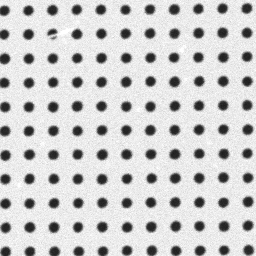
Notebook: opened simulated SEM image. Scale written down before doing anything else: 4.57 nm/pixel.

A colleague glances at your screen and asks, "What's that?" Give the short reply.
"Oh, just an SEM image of a regular array of holes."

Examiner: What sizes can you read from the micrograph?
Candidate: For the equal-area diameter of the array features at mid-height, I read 10.5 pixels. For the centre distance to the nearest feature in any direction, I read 108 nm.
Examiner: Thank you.